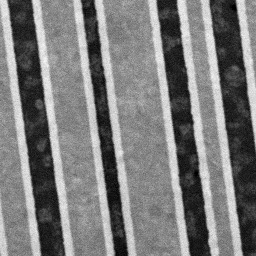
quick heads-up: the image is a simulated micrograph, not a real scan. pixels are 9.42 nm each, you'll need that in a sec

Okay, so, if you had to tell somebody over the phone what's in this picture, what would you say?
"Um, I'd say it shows one or a few lines or trenches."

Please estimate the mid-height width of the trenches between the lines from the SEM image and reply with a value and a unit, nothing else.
262 nanometres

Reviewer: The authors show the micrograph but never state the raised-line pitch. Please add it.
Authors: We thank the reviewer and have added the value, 0.639 µm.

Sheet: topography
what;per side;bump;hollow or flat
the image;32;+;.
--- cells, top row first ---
+...++++++..+++++++....+++....++
+....+++++..+++++++....+++....++
+....+++++...++++++....+++....++
+....+++++...+++++++...+++....++
+....+++++...+++++++...+++.....+
+....+++++...+++++++...+++.....+
+....++++++..+++++++...++++....+
++...++++++..+++++++...++++....+
++....+++++..+++++++....+++....+
++....+++++...++++++....+++....+
++....+++++...+++++++...+++....+
++....+++++...+++++++...+++....+
++....+++++...+++++++...+++.....
++....+++++...+++++++...+++.....
++....++++++..+++++++...++++....
+++....+++++..+++++++....+++....
+++....+++++..+++++++....+++....
+++....+++++...++++++....+++....
+++....+++++...+++++++...+++....
+++....+++++...+++++++...+++....
+++....+++++...+++++++...+++....
+++....+++++...+++++++...++++...
+++....++++++..+++++++....+++...
++++....+++++..+++++++....+++...
++++....+++++..+++++++....+++...
++++....+++++...++++++....+++...
++++....+++++...+++++++...+++...
++++....+++++...+++++++...+++...
++++....+++++...+++++++...+++...
++++....++++++..+++++++....+++..
++++....++++++..+++++++....+++..
+++++....+++++..+++++++....+++..